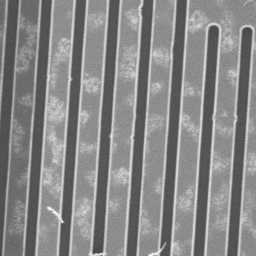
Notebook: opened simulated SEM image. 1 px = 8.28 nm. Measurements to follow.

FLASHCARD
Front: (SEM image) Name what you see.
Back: parallel lines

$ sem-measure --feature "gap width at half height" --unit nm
96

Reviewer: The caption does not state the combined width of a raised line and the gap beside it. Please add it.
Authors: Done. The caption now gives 278 nanometres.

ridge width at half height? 184 nm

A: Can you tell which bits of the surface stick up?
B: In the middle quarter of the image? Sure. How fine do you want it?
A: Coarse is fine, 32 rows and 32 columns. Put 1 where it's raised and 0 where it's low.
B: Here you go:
11000111110001111100001111100011
10000111110001111100001111100011
10001111110001111100011111100011
11001111110001111100011111100011
10001111110001111100011111100011
10001111110001111100011111100011
10001111110001111100011111100011
10001111110001111100011111000011
10001111100001111100011111000011
10001111100011111100011111000111
10001111100011111100011111000111
10001111100011111100011111000111
10001111100011111100011111000111
10001111100011111100011111000111
10001111100011111100011111000111
10001111100011111000011111000111
00001111100011111000011111000111
00011111100011111000111111000111
00011111100011111000111111000111
00011111100011111000111111000111
00011111100011111000111111000111
00011111100011111000111111000111
00011111100011111000111110000111
00011111000011111000111110000111
00011111000111111000111110001111
00011111000111111000111110001111
00011111000111111000111110001111
00011111000111111000111110001111
00011111000111111000111110001111
00011111000111111000111110001111
00011111000111110000111110001111
00011111000111110001111110001111